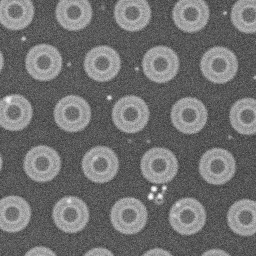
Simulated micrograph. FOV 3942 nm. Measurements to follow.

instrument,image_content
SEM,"an array of small figures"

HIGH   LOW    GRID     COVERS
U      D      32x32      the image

UUUUDDDUUUUDDDDUUUDDDDUUUUDDDUUU
UUUUDDDUUUUDDDUUUUUDDDUUUUDDDUUU
UUUUDDDUUUUDDDUUUUUDDDUUUUDDDUUU
DUUDDDDDUUDDDDDUUUDDDDUUUDDDDDUU
DDDDDDDDDDDDDDDDDDDDDDDDDDDDDDDD
DDDDDDDDDDDDDDDDDDDDDDDDDDDDDDDD
DDDDUUUDDDDUUUDDDDUUUUDDDDUUUDDD
DDDUUUUUDDDUUUUDDDUUUUDDDUUUUUDD
DDDUUUUUDDDUUUUDDDUUUUDDDUUUUUDD
DDDDUUUDDDDUUUDDDDUUUUDDDDUUUDDD
DDDDDDDDDDDDDDDDDDDDDDDDDDDDDDDD
DDDDDDDDDDDDDDDDDDDDDDDDDDDDDDDD
UUUDDDDDUUUDDDDUUUDDDDUUUDDDDDUU
UUUUDDDUUUUDDDUUUUDDDDUUUUDDDUUU
UUUUDDDUUUUDDDUUUUUDDUUUUUDDDUUU
UUUDDDDUUUUDDDUUUUDDDDUUUUDDDUUU
DDDDDDDDDDDDDDDDUDDDDDDUUDDDDDUU
DDDDDDDDDDDDDDDDDDDDDDDDDDDDDDDD
DDDDUUDDDDDDUDDDDDDDDDDDDDDDDDDD
DDDUUUUDDDDUUUUDDDUUUUDDDUUUUDDD
DDDUUUUUDDUUUUUDDDUUUUDDDUUUUDDD
DDDUUUUDDDUUUUUDDDUUUUDDDUUUUDDD
DDDDUUDDDDDUUUDDDDDUUDDDDDUUUDDD
DDDDDDDDDDDDDDDDDDDDDDDDDDDDDDDD
DDDDDDDDDDDDDDDDDDDDDDDDDDDDDDDD
UUUDDDDUUUUDDDUUUUDDDDUUUDDDDUUU
UUUUDDDUUUUDDDUUUUDDDUUUUUDDDUUU
UUUUDDDUUUUDDDUUUUDDDUUUUUDDUUUU
UUUDDDDUUUDDDDUUUUDDDDUUUDDDDUUU
DDDDDDDDDDDDDDDDDDDDDDDDDDDDDDDD
DDDDDDDDDDDDDDDDDDDDDDDDDDDDDDDD
DDDDUUUDDDDUUUDDDDUUUDDDDDUUDDDD